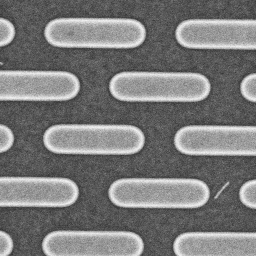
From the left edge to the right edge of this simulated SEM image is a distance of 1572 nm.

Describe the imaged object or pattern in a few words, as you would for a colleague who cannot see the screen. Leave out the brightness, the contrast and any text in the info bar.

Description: groups of lines, slits or small figures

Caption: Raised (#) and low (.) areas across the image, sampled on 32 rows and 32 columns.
................................
................................
#......########.................
##....############....##########
##....############....##########
#......##########......#########
................................
................................
................................
#########.....###########......#
##########....############....##
##########....############....##
...............##########......#
................................
................................
................................
#.....############....##########
##....############....##########
#.....############....##########
................................
................................
................................
#########......##########.......
##########....############....##
##########....############....##
#########......##########......#
................................
................................
................................
#.....###########......#########
#....#############....##########
#.....############....##########